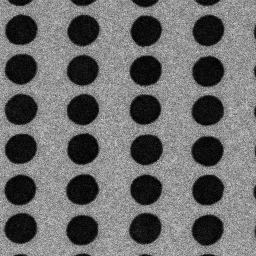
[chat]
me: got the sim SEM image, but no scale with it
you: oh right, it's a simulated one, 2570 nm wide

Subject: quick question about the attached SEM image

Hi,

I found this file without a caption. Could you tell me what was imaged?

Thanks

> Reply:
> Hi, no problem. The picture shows a regular array of holes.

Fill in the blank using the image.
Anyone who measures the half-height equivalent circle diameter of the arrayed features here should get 314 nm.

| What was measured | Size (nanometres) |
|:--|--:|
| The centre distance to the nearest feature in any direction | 394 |